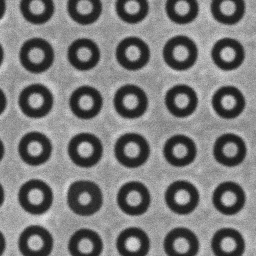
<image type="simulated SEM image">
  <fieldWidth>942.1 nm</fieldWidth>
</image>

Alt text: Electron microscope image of a regular array of ring-shaped grooves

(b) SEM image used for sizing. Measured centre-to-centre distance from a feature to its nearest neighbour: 173 nm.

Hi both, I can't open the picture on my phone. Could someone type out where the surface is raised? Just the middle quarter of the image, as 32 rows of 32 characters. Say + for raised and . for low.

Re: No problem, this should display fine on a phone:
++......++++++......++++++......
+++...++++++++++..++++++++++..++
++++++++++++++++++++++++++++++++
++++++++++++++++++++++++++++++++
++++++++++++++++++++++++++++++++
++++..+++++++++...++++++++++...+
+++.....+++++.......++++++......
++.......++++...+....+++++......
+...+++...++...+++...++++...+++.
+...+++...++...+++...++++...+++.
+...+++...++...+++...+++++..+++.
++.......++++........+++++......
+++......+++++......+++++++.....
++++...+++++++++..++++++++++++++
++++++++++++++++++++++++++++++++
++++++++++++++++++++++++++++++++
++++++++++++++++++++++++++++++++
++++...+++++++++..++++++++++++++
++......++++++......++++++.....+
+........++++........++++.......
+...+++..++++..++++..++++...++..
+..++++...++...++++...+++..++++.
+...+++..++++..++++..++++..++++.
++.......++++........++++...++..
++......++++++......++++++......
++++...++++++++....+++++++++..++
++++++++++++++++++++++++++++++++
++++++++++++++++++++++++++++++++
++++++++++++++++++++++++++++++++
+++....+++++++++...++++++++....+
+.......+++++++.....++++++......
+........+++++.......+++++...+..